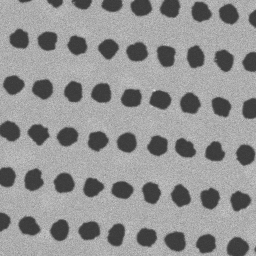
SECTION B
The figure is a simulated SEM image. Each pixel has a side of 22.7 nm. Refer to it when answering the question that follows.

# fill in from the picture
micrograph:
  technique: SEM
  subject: a regular array of holes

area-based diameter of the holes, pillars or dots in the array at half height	443	nm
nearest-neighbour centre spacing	663	nm